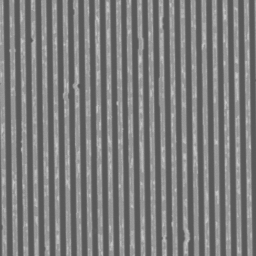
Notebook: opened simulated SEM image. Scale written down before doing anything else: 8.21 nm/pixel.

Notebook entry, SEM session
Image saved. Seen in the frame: parallel lines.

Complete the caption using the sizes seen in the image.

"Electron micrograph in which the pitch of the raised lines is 87.5 nm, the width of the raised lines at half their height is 45.1 nm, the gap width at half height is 46.2 nm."